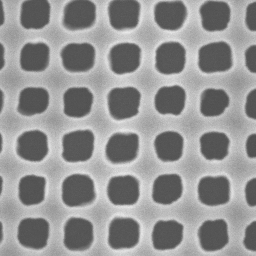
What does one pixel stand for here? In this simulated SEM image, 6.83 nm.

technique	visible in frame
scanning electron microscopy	a regular array of holes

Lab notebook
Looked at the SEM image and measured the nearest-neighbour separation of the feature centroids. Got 299 nm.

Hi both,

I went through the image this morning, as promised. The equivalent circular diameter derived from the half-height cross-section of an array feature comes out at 0.219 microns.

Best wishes